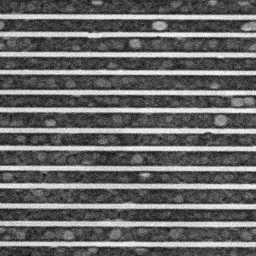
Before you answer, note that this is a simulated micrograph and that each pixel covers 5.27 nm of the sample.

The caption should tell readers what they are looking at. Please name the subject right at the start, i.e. parallel lines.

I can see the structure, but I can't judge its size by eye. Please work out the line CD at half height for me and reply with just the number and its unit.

15.8 nanometres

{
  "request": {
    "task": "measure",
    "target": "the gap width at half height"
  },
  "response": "79 nanometers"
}